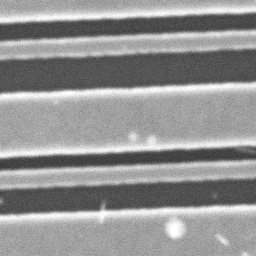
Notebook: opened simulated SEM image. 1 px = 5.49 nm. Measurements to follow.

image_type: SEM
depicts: lines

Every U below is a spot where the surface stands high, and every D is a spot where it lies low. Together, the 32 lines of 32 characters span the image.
UUUUUUUUUUUUUUUUUUUUUUUUUUUUUUUU
UUUUUUUUUUUUUUUUUUUUUUUUUUUUUUUD
UUUUUUUDDDDDDDDDDDDDDDDDDDDDDDDD
DDDDDDDDDDDDDDDDDDDDDDDDDDDDDDDD
DDDDDDDDDDDDDDDDDDUUUUUUUUUUUUUU
UUUUUUUUUUUUUUUUUUUUUUUUUUUUUUUU
UUUUUUUUUUUUUUUUUUDDDDDDDDDDDDDD
DDDDDDDDDDDDDDDDDDDDDDDDDDDDDDDD
DDDDDDDDDDDDDDDDDDDDDDDDDDDDDDDD
DDDDDDDDDDDDDDDDDDDDDDDDDDDDDDDD
DDDDDDDDDDDDDDDDDDDDDDDDDDDDDDDU
DDDDDDDUUUUUUUUUUUUUUUUUUUUUUUUU
UUUUUUUUUUUUUUUUUUUUUUUUUUUUUUUU
UUUUUUUUUUUUUUUUUUUUUUUUUUUUUUUU
UUUUUUUUUUUUUUUUUUUUUUUUUUUUUUUU
UUUUUUUUUUUUUUUUUUUUUUUUUUUUUUUU
UUUUUUUUUUUUUUUUUUUUUUUUUUUUUUUU
UUUUUUUUUUUUUUUUUUUUUUUUUUUUUUUU
UUUUUUUUUUUUUUUUUUUUUUDDDDDDDDDD
UUDDDDDDDDDDDDDDDDDDDDDDDDDDDDDD
DDDDDDDDDDDDDDDDDDDDDDUUUUUUUUUU
DUUUUUUUUUUUUUUUUUUUUUUUUUUUUUUU
UUUUUUUUUUUUUUUUUUUUUUUDDDDDDDDD
DDDDDDDDDDDDDDDDDDDDDDDDDDDDDDDD
DDDDDDDDDDDDDDDDDDDDDDDDDDDDDDDD
DDDDDDDDDDDDDDDDDDDDDDDDDDDDDDDD
DDDDDDDDDDDDUUUUUUUUUUUUUUUUUUUU
UUUUUUUUUUUUUUUUUUUUUUUUUUUUUUUU
UUUUUUUUUUUUUUUUUUUUUUUUUUUUUUUU
UUUUUUUUUUUUUUUUUUUUUUUUUUUUUUUU
UUUUUUUUUUUUUUUUUUUUUUUUUUUUUUUU
UUUUUUUUUUUUUUUUUUUUUUUUUUUUUUUU